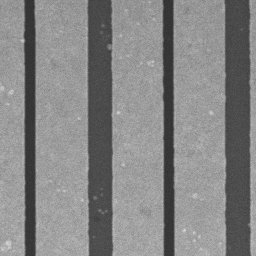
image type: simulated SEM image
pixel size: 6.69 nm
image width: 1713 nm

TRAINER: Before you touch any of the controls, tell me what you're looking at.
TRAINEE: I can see lines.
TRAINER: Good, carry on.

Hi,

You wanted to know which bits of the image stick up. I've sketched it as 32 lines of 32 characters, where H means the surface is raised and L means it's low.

HHHLHHHHHHHLLLHHHHHHLLHHHHHHLLLH
HHHLHHHHHHHLLLHHHHHHLLHHHHHHLLLH
HHHLHHHHHHHLLLHHHHHHLLHHHHHHLLLH
HHHLHHHHHHHLLLHHHHHHLLHHHHHHLLLH
HHHLLHHHHHHLLLHHHHHHLLHHHHHHLLLH
HHHLLHHHHHHLLLHHHHHHLLHHHHHHLLLH
HHHLLHHHHHHLLLHHHHHHLLHHHHHHLLLH
HHHLLHHHHHHLLLHHHHHHLLHHHHHHLLLH
HHHLLHHHHHHLLLHHHHHHLLHHHHHHLLLH
HHHLLHHHHHHLLLHHHHHHLLHHHHHHLLLH
HHHLLHHHHHHLLLHHHHHHLLHHHHHHLLLH
HHHLLHHHHHHLLLHHHHHHLLHHHHHHLLLH
HHHLLHHHHHHLLLHHHHHHLLHHHHHHLLLH
HHHLLHHHHHHLLLHHHHHHLLHHHHHHLLLH
HHHLLHHHHHHLLLHHHHHHLLHHHHHHLLLH
HHHLLHHHHHHLLLHHHHHHLLHHHHHHLLLH
HHHLLHHHHHHLLLHHHHHHLLHHHHHHLLLH
HHHLLHHHHHHLLLHHHHHHLLHHHHHHLLLH
HHHLLHHHHHHLLLHHHHHHLLHHHHHHLLLH
HHHLLHHHHHHLLLHHHHHHLLHHHHHHLLLH
HHHLLHHHHHHLLLHHHHHHLLHHHHHHLLLH
HHHLLHHHHHHLLLHHHHHHLLHHHHHHLLLH
HHHLLHHHHHHLLLHHHHHHLLHHHHHHLLLH
HHHLLHHHHHHLLLHHHHHHLLHHHHHHLLLH
HHHLLHHHHHHLLLHHHHHHLLHHHHHHLLLH
HHHLLHHHHHHLLLHHHHHHLLHHHHHHLLLH
HHHLLHHHHHHLLLHHHHHHLLHHHHHHLLLH
HHHLLHHHHHHLLLHHHHHHLLHHHHHHLLLH
HHHLLHHHHHHLLLHHHHHHHLHHHHHHLLLH
HHHLLHHHHHHLLLHHHHHHLLHHHHHHLLLH
HHHLLHHHHHHLLLHHHHHHLLHHHHHHLLLH
HHHLLHHHHHHLLLHHHHHHLLHHHHHHLLLH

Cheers